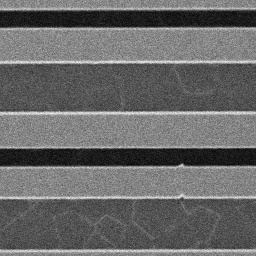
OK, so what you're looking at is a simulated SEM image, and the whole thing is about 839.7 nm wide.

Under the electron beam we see one or a few lines or trenches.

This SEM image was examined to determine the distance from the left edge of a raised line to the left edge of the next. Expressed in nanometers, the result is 225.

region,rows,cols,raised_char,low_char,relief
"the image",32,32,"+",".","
++++++++++++++++++++++++++++++++
................................
................................
.....++.........................
++++++++++++++++++++++++++++++++
++++++++++++++++++++++++++++++++
++++++++++++++++++++++++++++++++
++++++++++++++++++++++++++++++++
................................
................................
................................
................................
................................
................................
++++++++++++++++++++++++++++++++
++++++++++++++++++++++++++++++++
++++++++++++++++++++++++++++++++
++++++++++++++++++++++++++++++++
++++++++++++++.++.+++++++++++...
................................
................................
++++++++++++++++++++++++++++++++
++++++++++++++++++++++++++++++++
++++++++++++++++++++++++++++++++
++++++++++++++++++++++++++++++++
................................
................................
................................
................................
................................
................................
++++++++++++++++++++++++++++++++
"